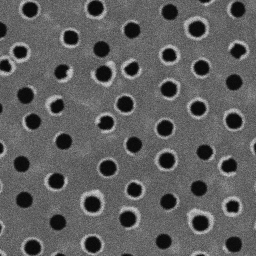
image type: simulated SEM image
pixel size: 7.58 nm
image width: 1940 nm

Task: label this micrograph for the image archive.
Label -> a regular array of holes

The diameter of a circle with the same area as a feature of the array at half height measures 16.3 pixels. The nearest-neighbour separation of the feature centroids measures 0.26 micrometres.